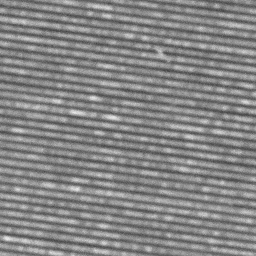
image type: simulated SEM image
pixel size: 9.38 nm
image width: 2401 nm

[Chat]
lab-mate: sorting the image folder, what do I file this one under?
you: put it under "parallel lines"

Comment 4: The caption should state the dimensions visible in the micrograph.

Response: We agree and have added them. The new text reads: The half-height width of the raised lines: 0.0476 um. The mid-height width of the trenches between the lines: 31.4 nm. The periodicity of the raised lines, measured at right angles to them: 0.0782 um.